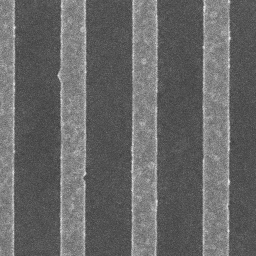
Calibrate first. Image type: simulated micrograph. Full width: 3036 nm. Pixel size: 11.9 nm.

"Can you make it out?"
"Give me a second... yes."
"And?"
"one or a few lines or trenches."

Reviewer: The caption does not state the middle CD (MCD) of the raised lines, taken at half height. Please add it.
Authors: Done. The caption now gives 295 nm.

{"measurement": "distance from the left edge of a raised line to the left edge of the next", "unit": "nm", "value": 842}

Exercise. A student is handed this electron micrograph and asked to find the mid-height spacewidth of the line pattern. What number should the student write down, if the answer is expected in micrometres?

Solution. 0.552